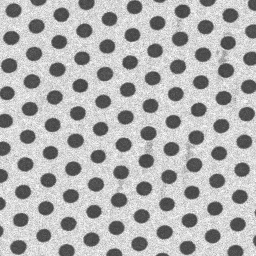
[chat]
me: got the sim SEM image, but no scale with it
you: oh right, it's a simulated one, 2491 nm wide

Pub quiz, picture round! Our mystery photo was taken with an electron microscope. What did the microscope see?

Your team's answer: a regular array of holes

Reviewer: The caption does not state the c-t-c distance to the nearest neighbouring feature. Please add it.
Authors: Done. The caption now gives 267 nanometers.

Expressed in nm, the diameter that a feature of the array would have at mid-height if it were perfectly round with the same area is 146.